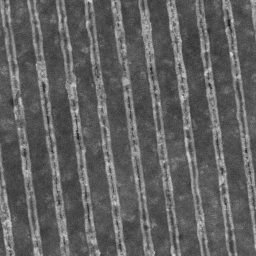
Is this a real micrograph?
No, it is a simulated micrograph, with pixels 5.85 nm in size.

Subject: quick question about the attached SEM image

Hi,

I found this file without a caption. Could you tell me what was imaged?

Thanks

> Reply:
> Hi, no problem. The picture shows parallel lines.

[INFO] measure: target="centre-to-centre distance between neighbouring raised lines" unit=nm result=161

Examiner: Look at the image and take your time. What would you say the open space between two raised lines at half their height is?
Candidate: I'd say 121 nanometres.